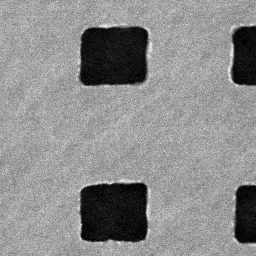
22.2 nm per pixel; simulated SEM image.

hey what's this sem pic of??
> holes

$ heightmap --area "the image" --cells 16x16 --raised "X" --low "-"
XXXXXXXXXXXXXXXX
XXXXXXXXXXXXXXXX
XXXXX----XXXXXX-
XXXXX----XXXXXX-
XXXXX----XXXXX--
XXXXXXXXXXXXXXXX
XXXXXXXXXXXXXXXX
XXXXXXXXXXXXXXXX
XXXXXXXXXXXXXXXX
XXXXXXXXXXXXXXXX
XXXXXXXXXXXXXXXX
XXXXXXX--XXXXXXX
XXXXX----XXXXXX-
XXXXX----XXXXXX-
XXXXX----XXXXXX-
XXXXXXXXXXXXXXXX